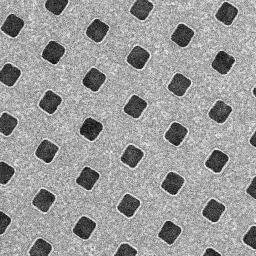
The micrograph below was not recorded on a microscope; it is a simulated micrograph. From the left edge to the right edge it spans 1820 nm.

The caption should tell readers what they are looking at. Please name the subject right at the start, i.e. a regular array of holes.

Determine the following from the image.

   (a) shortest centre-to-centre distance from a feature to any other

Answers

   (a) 0.348 microns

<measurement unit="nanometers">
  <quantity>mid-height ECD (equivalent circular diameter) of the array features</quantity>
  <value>158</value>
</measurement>